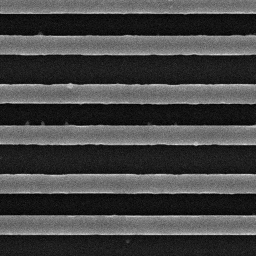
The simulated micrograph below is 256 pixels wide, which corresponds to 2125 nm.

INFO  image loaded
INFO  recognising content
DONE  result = lines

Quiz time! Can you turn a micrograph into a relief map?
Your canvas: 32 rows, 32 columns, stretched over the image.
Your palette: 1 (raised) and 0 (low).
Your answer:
11111111111111111111111111111111
11111111111111111111111111111111
00000000000000000000000000000000
00000000000000000000000000000000
10000000000000011000000001000001
11111111111111111111111111111111
11111111111111111111111111111111
00000000000000000000000000000000
00000000000000000000000000000000
00000000000000000000000000000000
00000000100000000000000000000000
11111111111111111111111111111111
11111111111111111111111111111111
00000000000000000000000000000000
00000000000000000000000000000000
00000000000000000000000000000000
11111111111111111111111111111111
11111111111111111111111111111111
00000000000000000000000000000000
00000000000000000000000000000000
00000000000000000000000000000000
00000000000000000000000000000000
11111111111111111111111111111111
11111111111111111111111111111111
00000000000000000000000000000000
00000000000000000000000000000000
00000000000000000000000000000000
11111111111111111111111111111111
11111111111111111111111111111111
00000000000000000000000000000000
00000000000000000000000000000000
00000000000000000000000000000000